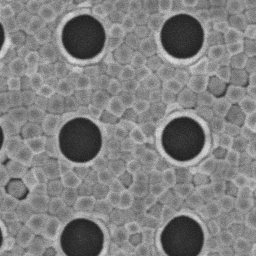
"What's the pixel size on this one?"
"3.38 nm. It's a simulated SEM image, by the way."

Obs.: holes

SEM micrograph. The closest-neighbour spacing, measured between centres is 0.34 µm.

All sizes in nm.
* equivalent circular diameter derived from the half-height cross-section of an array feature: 155